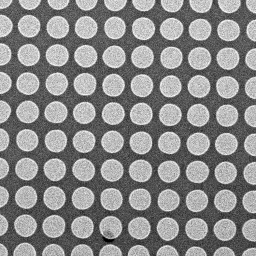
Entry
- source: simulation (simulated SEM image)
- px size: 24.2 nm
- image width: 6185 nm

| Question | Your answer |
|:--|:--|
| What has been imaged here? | an array of small figures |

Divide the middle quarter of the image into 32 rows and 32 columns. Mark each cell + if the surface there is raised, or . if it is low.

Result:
....++.....+++....+++....+++....
................................
....++..........................
+..+++++..++++....+++....+++....
+..+++++..+++++..+++++..+++++..+
+..+++++..+++++..+++++..+++++..+
...+++++..+++++..+++++..+++++..+
....+++....+++....+++....+++....
................................
................................
...++++...++++....+++....+++....
+.++++++..+++++..+++++..+++++..+
+.++++++..+++++..+++++..+++++..+
...++++...+++++..+++++..+++++..+
....++.....+++...++++....+++...+
................................
................................
...++++...++++....+++....+++....
..++++++..++++...+++++..+++++..+
..++++++.++++++..+++++..+++++..+
...++++...+++++..+++++..+++++..+
...++++...++++...++++...++++...+
................................
................................
...++++...++++....+++....++.....
..+++++...++++...+++++..++++...+
..++++++.++++++.++++++..+++++..+
...++++..++++++..+++++..+++++..+
...++++...++++...++++...++++...+
................................
................................
...++++....++.....++............